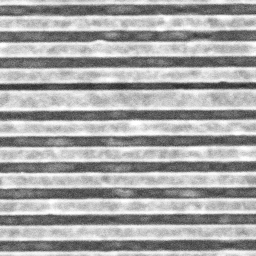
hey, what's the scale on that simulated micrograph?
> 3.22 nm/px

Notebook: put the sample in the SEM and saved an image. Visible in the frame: parallel lines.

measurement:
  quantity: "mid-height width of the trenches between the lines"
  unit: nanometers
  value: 39.5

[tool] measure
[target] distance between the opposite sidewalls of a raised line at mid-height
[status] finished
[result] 42.7 nm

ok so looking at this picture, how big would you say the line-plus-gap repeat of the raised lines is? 26.2 px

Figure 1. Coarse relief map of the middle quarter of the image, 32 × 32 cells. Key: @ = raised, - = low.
--------------------------------
@@@@@@@@@@@@@@@@@@@@@@@@@@@@@@@@
@@@@@@@@@@@@@@@@@@@@@@@@@@@@@@@@
@@@@@@@@@@@@@@@@@@@@@@@@@@@@@@@@
--------------------------------
--------------------------------
--------------------------------
@@@@@@@@@@@@@@@@@@@@@@@@@@@@@@@@
@@@@@@@@@@@@@@@@@@@@@@@@@@@@@@@@
@@@@@@@@@@@@@@@@@@@@@@@@@@@@@@@@
@@@@@@@@@@@@@@@@@@@@@@@@@@@@@@@@
--------------------------------
--------------------------------
--------------------------------
-------------@@@----@@@@@@@@@@@@
@@@@@@@@@@@@@@@@@@@@@@@@@@@@@@@@
@@@@@@@@@@@@@@@@@@@@@@@@@@@@@@@@
@@@@@@@@@@@@@@@@@@@@@@@@@@@@@@@@
--------------------------------
--------------------------------
--------------------------------
@@@@@@@@@@@@@@@@@@@@@@@@@@@@@@@@
@@@@@@@@@@@@@@@@@@@@@@@@@@@@@@@@
@@@@@@@@@@@@@@@@@@@@@@@@@@@@@@@@
--------------------------------
--------------------------------
--------------------------------
------------------@@@@@@@@@@@@@@
@@@@@@@@@@@@@@@@@@@@@@@@@@@@@@@@
@@@@@@@@@@@@@@@@@@@@@@@@@@@@@@@@
@@@@@@@@@@@@@@@@@@@@@@@@@@@@@@--
--------------------------------